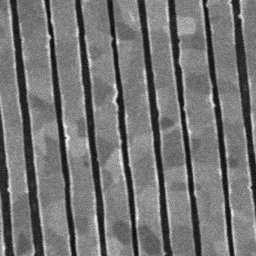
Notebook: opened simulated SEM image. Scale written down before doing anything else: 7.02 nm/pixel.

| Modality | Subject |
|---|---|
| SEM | parallel lines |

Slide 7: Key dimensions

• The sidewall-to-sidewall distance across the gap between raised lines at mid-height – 51.5 nanometres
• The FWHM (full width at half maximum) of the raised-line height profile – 172 nm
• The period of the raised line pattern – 221 nm